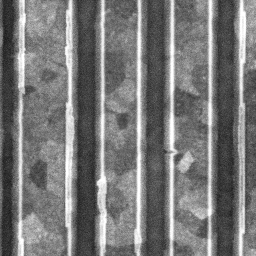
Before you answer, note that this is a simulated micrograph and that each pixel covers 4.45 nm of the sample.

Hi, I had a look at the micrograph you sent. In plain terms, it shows one or a few lines or trenches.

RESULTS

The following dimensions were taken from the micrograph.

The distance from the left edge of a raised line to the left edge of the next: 0.324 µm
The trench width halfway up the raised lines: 138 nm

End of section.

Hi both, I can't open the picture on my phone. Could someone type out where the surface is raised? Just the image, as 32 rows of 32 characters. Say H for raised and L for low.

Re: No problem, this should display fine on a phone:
LLLHHHHHHLLLLHHHHLLLLLHHHHLLLLHH
LLLHHHHHHLLLLHHHHLLLLLHHHHLLLLHH
LLLHHHHHHLLLLHHHHLLLLLHHHHLLLLHH
LLLHHHHHHLLLLHHHHLLLLLHHHHLLLLHH
LLHHHHHHHLLLLHHHHLLLLLHHHHLLLLHH
LLHHHHHHHLLLLHHHHLLLLLHHHHLLLLHH
LLHHHHHHHLLLLHHHHLLLLLHHHHLLLLHH
LLHHHHHHHLLLLHHHHLLLLLHHHHLLLLHH
LLHHHHHHHLLLLHHHHLLLLLHHHHLLLLHH
LLHHHHHHHLLLLHHHHLLLLLHHHHLLLLHH
LLHHHHHHHLLLLHHHHLLLLLHHHHLLLLHH
LLHHHHHHHLLLLHHHHLLLLLHHHHLLLLHH
LLLHHHHHHLLLLHHHHLLLLLHHHHLLLLHH
LLLHHHHHHLLLLHHHHLLLLLHHHHLLLLHH
LLLHHHHHHLLLLHHHHLLLLLHHHHLLLLHH
LLLHHHHHHLLLLHHHHLLLLLHHHHLLLLHH
LLLHHHHHHLLLLHHHHLLLLLHHHHLLLLHH
LLLHHHHHHLLLLHHHHLLLLLHHHHLLLLHH
LLLHHHHHHLLLLHHHHLLLLLHHHHLLLLHH
LLLHHHHHHLLLLHHHHLLLLLHHHHLLLLHH
LLLHHHHHHLLLLHHHHLLLLLHHHHLLLLHH
LLLHHHHHHLLLLHHHHLLLLLHHHHLLLLHH
LLLHHHHHHLLLHHHHHLLLLLHHHHLLLLHH
LLLHHHHHHLLLHHHHHLLLLLHHHHLLLLHH
LLLHHHHHHLLLHHHHHLLLLLHHHHLLLLHH
LLLHHHHHHLLLHHHHHLLLLLHHHHLLLLHH
LLLHHHHHHLLLLHHHHLLLLLHHHHLLLLHH
LLLHHHHHHLLLLHHHHLLLLLHHHHLLLLHH
LLLHHHHHHLLLLHHHHLLLLLHHHHLLLLHH
LLLHHHHHHLLLLHHHHLLLLLHHHHLLLLHH
LLHHHHHHHLLLLHHHHHLLLLHHHHLLLLHH
LLHHHHHHHLLLLHHHHLLLLHHHHHLLLLHH